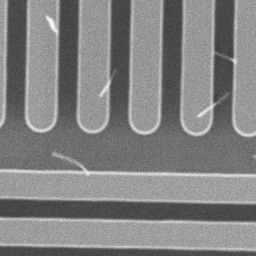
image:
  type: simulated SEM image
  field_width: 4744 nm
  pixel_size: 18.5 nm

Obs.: groups of lines, slits or small figures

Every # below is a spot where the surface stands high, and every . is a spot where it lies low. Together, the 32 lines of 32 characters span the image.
#..####...####...###...####..###
#..####...####..####...####..###
#..####...####..####...####..###
#..####...####..####...####..###
#..####...####..####...####..###
#..####...####..####...####..###
#..####...####..####...####..###
#..####...####..####...####..###
#..####...####..####...####..###
#..####...####..####...####..###
#..####...####..####...####..###
#..####...####..####...###...###
#..####...####..####...####..###
#..####...####..####...####..###
#..####...####..####...###...###
....###...###...####...###...###
...........#.....##.....##....##
................................
................................
................................
................................
#####.....#.....................
################################
################################
################################
................................
................................
#################...............
################################
################################
################################
................................